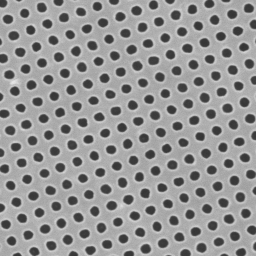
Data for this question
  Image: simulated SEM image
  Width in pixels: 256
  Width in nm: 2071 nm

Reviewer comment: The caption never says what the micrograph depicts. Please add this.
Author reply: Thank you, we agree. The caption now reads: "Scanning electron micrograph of a regular array of holes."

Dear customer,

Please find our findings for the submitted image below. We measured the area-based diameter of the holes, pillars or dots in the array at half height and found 9.64 px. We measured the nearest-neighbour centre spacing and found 140 nm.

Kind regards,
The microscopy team